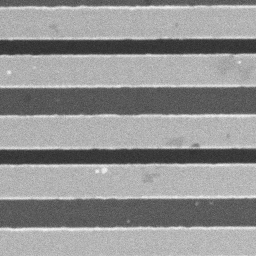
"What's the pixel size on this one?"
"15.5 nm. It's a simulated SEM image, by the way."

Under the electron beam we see lines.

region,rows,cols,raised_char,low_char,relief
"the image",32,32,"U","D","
DDDDDDDDDDDDDDDDDDDDDDDDDDDDDDDD
UUUUUUUUUUUUUUUUUUUUUUUUUUUUUUUU
UUUUUUUUUUUUUUUUUUUUUUUUUUUUUUUU
UUUUUUUUUUUUUUUUUUUUUUUUUUUUUUUU
UUUUUUUUUUUUUUUUUUUUUUUUUUUUUUUU
DDDDDDDDDDDDDDDDDDDDDDDDDDDDDDDD
DDDDDDDDDDDDDDDDDDDDDDDDDDDDDDDD
UUUUUUUUUUUUUUUUUUUUUUUUUUUUUUUU
UUUUUUUUUUUUUUUUUUUUUUUUUUUUUUUU
UUUUUUUUUUUUUUUUUUUUUUUUUUUUUUUU
UUUUUUUUUUUUUUUUUUUUUUUUUUUUUUUU
DDDDDDDDDDDDDDDDDDDDDDDDDDDDDDDD
DDDDDDDDDDDDDDDDDDDDDDDDDDDDDDDD
DDDDDDDDDDDDDDDDDDDDDDDDDDDDDDDD
DDDDDDUUDDDDUUUDDUUUUUUUUUUUUUUU
UUUUUUUUUUUUUUUUUUUUUUUUUUUUUUUU
UUUUUUUUUUUUUUUUUUUUUUUUUUUUUUUU
UUUUUUUUUUUUUUUUUUUUUUUUUUUUUUUU
UUUUUUUUUUUUUUUDUDDDDDDDDDDDDDDD
DDDDDDDDDDDDDDDDDDDDDDDDDDDDDDDD
DDDDDDDDDDDDDDDDDDDDDDDDDDDDDDDD
UUUUUUUUUUUUUUUUUUUUUUUUUUUUUUUU
UUUUUUUUUUUUUUUUUUUUUUUUUUUUUUUU
UUUUUUUUUUUUUUUUUUUUUUUUUUUUUUUU
UUUUUUUUUUUUUUUUUUUUUUUUUUUUUUUU
DDDDDDDDDDDDDDDDDDDDDDDDDDDDDDDD
DDDDDDDDDDDDDDDDDDDDDDDDDDDDDDDD
DDDDDDDDDDDDDDDDDDDDDDDDDDDDDDDD
DDDDDDDUDDDDDDUUDUUDDUUUUUUUUUUU
UUUUUUUUUUUUUUUUUUUUUUUUUUUUUUUU
UUUUUUUUUUUUUUUUUUUUUUUUUUUUUUUU
UUUUUUUUUUUUUUUUUUUUUUUUUUUUUUUU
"